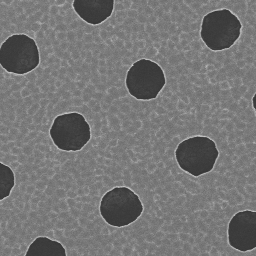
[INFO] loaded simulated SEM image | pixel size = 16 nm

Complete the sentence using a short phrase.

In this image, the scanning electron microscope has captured holes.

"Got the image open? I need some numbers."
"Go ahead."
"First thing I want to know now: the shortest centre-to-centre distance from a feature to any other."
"1450 nm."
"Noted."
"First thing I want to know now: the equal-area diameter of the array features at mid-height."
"642 nanometers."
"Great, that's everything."